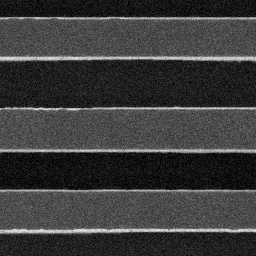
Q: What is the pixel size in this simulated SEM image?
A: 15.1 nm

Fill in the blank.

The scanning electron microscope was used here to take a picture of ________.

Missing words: lines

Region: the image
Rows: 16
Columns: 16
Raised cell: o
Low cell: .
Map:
................
oooooooooooooooo
oooooooooooooooo
oooooooooooooooo
................
................
................
oooooooooooooooo
oooooooooooooooo
................
................
................
oooooooooooooooo
oooooooooooooooo
................
................